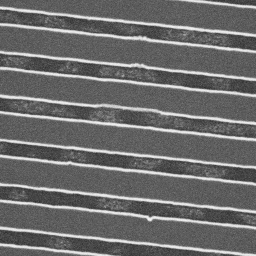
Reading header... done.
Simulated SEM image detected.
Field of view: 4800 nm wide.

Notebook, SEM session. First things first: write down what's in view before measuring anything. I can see parallel lines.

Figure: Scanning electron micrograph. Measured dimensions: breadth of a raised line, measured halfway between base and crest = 529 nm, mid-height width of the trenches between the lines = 291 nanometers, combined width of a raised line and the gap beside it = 822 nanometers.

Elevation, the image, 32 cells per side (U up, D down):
UUUUUUUUUUUUUUUUUUUUUUUUUUUUDDDD
DDDDUUUUUUUUUUUUUUUUUUUUUUUUUUUU
DDDDDDDDDDDDDDUUUUUUUUUUUUUUUUUU
UUUUUDDDDDDDDDDDDDDDDDDUUUUUUUUU
UUUUUUUUUUUUUUDDDDDDDDDDDDDDDDDD
UUUUUUUUUUUUUUUUUUUUUUUUDDDDDDDD
UUUUUUUUUUUUUUUUUUUUUUUUUUUUUUUU
DDDDDDDDDUUUUUUUUUUUUUUUUUUUUUUU
DDDDDDDDDDDDDDDDDDUUUUUUUUUUUUUU
UUUUUUUUUUDDDDDDDDDDDDDDDDDUUUUU
UUUUUUUUUUUUUUUUUUUDDDDDDDDDDDDD
UUUUUUUUUUUUUUUUUUUUUUUUUUUUUDDD
DDDDDUUUUUUUUUUUUUUUUUUUUUUUUUUU
DDDDDDDDDDDDDDDDUUUUUUUUUUUUUUUU
UUUUDDDDDDDDDDDDDDDDDDDUUUUUUUUU
UUUUUUUUUUUUUUDDDDDDDDDDDDDDDDDD
UUUUUUUUUUUUUUUUUUUUUUUDDDDDDDDD
UUUUUUUUUUUUUUUUUUUUUUUUUUUUUUUU
DDDDDDDDDUUUUUUUUUUUUUUUUUUUUUUU
DDDDDDDDDDDDDDDDDDUUUUUUUUUUUUUU
UUUUUUUUUUDDDDDDDDDDDDDDDDDUUUUU
UUUUUUUUUUUUUUUUUUDDDDDDDDDDDDDD
UUUUUUUUUUUUUUUUUUUUUUUUUUUDDDDD
DDDDUUUUUUUUUUUUUUUUUUUUUUUUUUUU
DDDDDDDDDDDDDUUUUUUUUUUUUUUUUUUU
UUUUDDDDDDDDDDDDDDDDDDDUUUUUUUUU
UUUUUUUUUUUUUDDDDDDDDDDDDDDDDDDD
UUUUUUUUUUUUUUUUUUUUUUUDDDDDDDDD
UUUUUUUUUUUUUUUUUUUUUUUUUUUUUUUU
DDDDDDDDDUUUUUUUUUUUUUUUUUUUUUUU
DDDDDDDDDDDDDDDDDDUUUUUUUUUUUUUU
UUUUUUUUUDDDDDDDDDDDDDDDDDDUUUUU